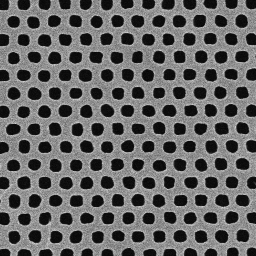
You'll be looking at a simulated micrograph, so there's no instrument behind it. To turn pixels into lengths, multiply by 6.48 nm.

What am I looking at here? a regular array of holes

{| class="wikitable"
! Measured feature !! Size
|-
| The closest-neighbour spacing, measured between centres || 20.2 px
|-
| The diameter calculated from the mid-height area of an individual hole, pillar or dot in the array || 81.8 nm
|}